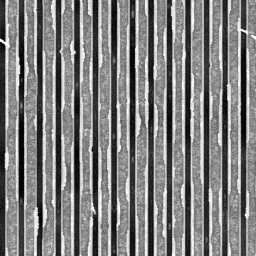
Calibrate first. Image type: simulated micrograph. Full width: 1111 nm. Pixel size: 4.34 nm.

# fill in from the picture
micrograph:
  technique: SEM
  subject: parallel lines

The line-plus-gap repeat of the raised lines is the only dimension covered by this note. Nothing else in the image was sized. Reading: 0.0803 um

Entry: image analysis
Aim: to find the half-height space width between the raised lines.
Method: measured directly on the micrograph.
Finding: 28.7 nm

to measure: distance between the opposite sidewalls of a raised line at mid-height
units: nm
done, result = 50.9